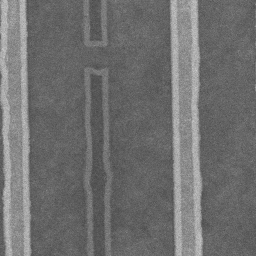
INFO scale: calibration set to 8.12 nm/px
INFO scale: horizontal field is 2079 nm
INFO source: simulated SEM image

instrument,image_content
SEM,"one or a few lines or trenches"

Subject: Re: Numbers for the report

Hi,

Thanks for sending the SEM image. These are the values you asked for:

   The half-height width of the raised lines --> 151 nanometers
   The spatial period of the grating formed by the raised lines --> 692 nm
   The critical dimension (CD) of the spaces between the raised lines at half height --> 535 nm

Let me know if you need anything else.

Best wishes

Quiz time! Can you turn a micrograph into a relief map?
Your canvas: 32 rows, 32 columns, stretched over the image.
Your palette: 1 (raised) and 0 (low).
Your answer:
01100000000110000000001100000000
01100000000110000000001100000000
11100000000110000000001100000000
01100000000110000000001100000000
01100000000110000000001100000000
01100000000000000000001100000000
11100000000000000000001100000000
11100000000000000000001100000000
11100000000000000000001100000000
01100000000110000000001100000000
01100000000110000000001100000000
01100000000110000000001100000000
01100000000110000000001100000000
01100000000110000000001100000000
01100000000110000000001100000000
01100000000110000000001100000000
01100000000110000000001100000000
01100000000110000000001100000000
01100000000110000000001100000000
01100000000110000000001100000000
01100000000110000000001100000000
01100000000111000000001110000000
01100000000111000000001110000000
01100000000111000000001110000000
01100000000110000000001110000000
01100000000110000000001110000000
01100000000110000000001110000000
01100000000110000000001110000000
01100000000110000000001110000000
01100000000111000000001110000000
01100000000111000000001110000000
01100000000111000000001110000000